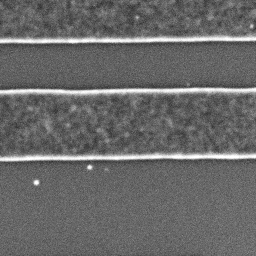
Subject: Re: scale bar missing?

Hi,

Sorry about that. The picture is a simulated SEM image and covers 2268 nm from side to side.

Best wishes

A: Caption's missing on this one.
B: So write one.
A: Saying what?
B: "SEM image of wiring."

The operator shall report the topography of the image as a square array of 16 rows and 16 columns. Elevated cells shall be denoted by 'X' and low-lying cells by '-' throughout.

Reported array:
XXXXXXXXXXXXXXXX
XXXXXXXXXXXXXXXX
XXXXXXXXXXXXX---
----------------
----------------
----------------
XXXXXXXXXXXXXXXX
XXXXXXXXXXXXXXXX
XXXXXXXXXXXXXXXX
XXXXXXXXXXXXXXXX
----------------
----------------
----------------
----------------
----------------
----------------